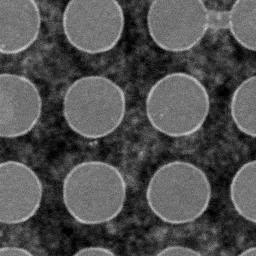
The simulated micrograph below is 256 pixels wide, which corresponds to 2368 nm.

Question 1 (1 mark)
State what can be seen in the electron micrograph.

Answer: raised bodies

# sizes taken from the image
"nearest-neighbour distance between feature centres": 779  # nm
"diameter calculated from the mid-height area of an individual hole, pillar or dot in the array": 564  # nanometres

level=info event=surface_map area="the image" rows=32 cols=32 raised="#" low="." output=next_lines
####.....######....######....###
#####...#######....########.####
#####...#######...##############
#####...#######....#######.#####
#####...#######....######....###
####.....#####......####......##
##.........#....................
................................
................................
##...................###........
####.....#####......#####.....##
#####...#######....#######...###
#####...#######...########...###
#####...#######...########...###
#####...#######....#######...###
####.....######....######.....##
###.......####......####.......#
................................
................................
................................
###.......###........##........#
####.....######.....#####.....##
#####...#######....#######...###
#####...#######....#######...###
#####...#######....#######...###
#####...#######....#######...###
####.....######....######.....##
###.......###........###.......#
................................
................................
................................
###.......####......####.......#